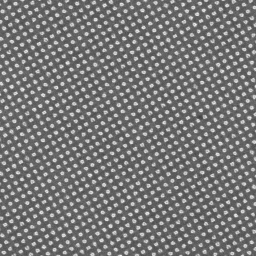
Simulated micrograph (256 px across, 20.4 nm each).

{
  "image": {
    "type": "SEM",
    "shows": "a regular array of raised bodies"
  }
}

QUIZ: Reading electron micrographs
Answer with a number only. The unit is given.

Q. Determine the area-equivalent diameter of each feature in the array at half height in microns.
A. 0.073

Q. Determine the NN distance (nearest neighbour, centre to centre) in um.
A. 0.15